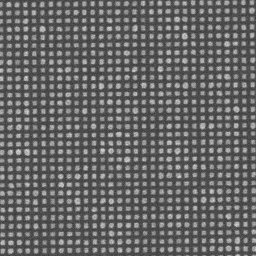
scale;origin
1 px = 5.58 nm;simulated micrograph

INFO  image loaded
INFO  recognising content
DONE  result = a regular array of raised bodies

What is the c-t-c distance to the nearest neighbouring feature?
7.85 px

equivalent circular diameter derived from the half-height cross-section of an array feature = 0.0252 µm